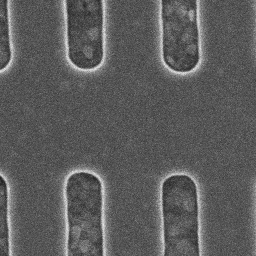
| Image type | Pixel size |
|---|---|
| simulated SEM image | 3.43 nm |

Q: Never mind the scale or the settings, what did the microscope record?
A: holes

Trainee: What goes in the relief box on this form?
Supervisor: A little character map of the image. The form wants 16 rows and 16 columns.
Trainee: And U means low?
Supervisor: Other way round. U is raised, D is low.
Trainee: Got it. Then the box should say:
DUUUDDUUUUDDUUUU
DUUUDDUUUUDDUUUU
DUUUDDUUUUDDUUUU
DUUUDDUUUUDDUUUU
UUUUUUUUUUUUUUUU
UUUUUUUUUUUUUUUU
UUUUUUUUUUUUUUUU
UUUUUUUUUUUUUUUU
UUUUUUUUUUUUUUUU
UUUUUUUUUUUUUUUU
UUUUUUUUUUUUUUUU
UUUUDDUUUUDDUUUU
UUUUDDUUUUDDUUUU
UUUUDDUUUUDDUUUU
DUUUDDUUUUDDUUUU
DUUUDDDUUUDDUUUU